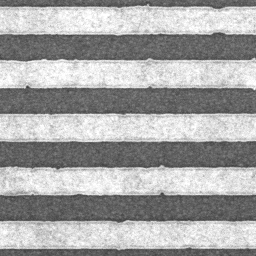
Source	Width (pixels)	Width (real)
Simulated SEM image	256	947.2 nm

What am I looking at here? parallel lines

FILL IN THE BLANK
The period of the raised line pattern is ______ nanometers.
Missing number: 198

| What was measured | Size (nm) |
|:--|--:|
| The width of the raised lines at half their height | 97.7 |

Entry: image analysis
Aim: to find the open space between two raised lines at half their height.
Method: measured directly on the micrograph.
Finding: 101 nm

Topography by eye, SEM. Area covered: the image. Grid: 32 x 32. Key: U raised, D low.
DDDDDDDDDDDDDDDDDDDDDDDDDDDDDDDD
UUUUUUUUUUUUUUUUUUUUUUUUUUUUUUUU
UUUUUUUUUUUUUUUUUUUUUUUUUUUUUUUU
UUUUUUUUUUUUUUUUUUUUUUUUUUUUUUUU
DDDDDDDDDDDDDDDDDDDDDDDDDDDDDDDD
DDDDDDDDDDDDDDDDDDDDDDDDDDDDDDDD
DDDDDDDDDDDDDDDDDDDDDDDDDDDDDDDD
DDDDDDDDDDDDDDDDDDDDDDDDDDDDDDDD
UUUUUUUUUUUUUUUUUUUUUUUUUUUUUUUU
UUUUUUUUUUUUUUUUUUUUUUUUUUUUUUUU
UUUUUUUUUUUUUUUUUUUUUUUUUUUUUUUU
DDDDDDDDDDDDDDDDDDDDDDDDDDDDDDDD
DDDDDDDDDDDDDDDDDDDDDDDDDDDDDDDD
DDDDDDDDDDDDDDDDDDDDDDDDDDDDDDDD
UUUUUUUUUUUUUUUUUUUUUUUUUUUUUUUU
UUUUUUUUUUUUUUUUUUUUUUUUUUUUUUUU
UUUUUUUUUUUUUUUUUUUUUUUUUUUUUUUU
UUUUUUUUUUUUUUUUUUUUUUUUUUUUUUUU
DDDDDDDDDDDDDDDDDDDDDDDDDDDDDDDD
DDDDDDDDDDDDDDDDDDDDDDDDDDDDDDDD
DDDDDDDDDDDDDDDDDDDDDDDDDDDDDDDD
UUUUUUUUUUUUUUUUUUUUUUUUUUUUUUUU
UUUUUUUUUUUUUUUUUUUUUUUUUUUUUUUU
UUUUUUUUUUUUUUUUUUUUUUUUUUUUUUUU
DDDDDDDDDDDDDDDDDDDDDDDDDDDDDDDD
DDDDDDDDDDDDDDDDDDDDDDDDDDDDDDDD
DDDDDDDDDDDDDDDDDDDDDDDDDDDDDDDD
DDDDDDDDDDDDDDDDDDDDDDDDDDDDDDDD
UUUUUUUUUUUUUUUUUUUUUUUUUUUUUUUU
UUUUUUUUUUUUUUUUUUUUUUUUUUUUUUUU
UUUUUUUUUUUUUUUUUUUUUUUUUUUUUUUU
DDDDDDDDDDDDDDDDDDDDDDDDDDDDDDDD